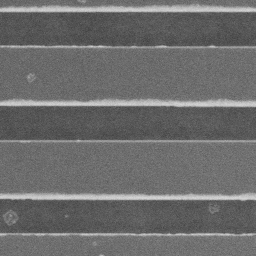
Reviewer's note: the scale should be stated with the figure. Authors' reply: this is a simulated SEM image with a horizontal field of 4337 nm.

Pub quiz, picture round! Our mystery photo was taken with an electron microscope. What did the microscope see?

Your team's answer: lines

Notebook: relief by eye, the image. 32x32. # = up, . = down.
################################
................................
................................
................................
................................
................................
################################
################################
################################
################################
################################
################################
################################
................................
................................
................................
................................
................................
################################
################################
################################
################################
################################
################################
################################
................................
................................
................................
................................
################################
################################
################################